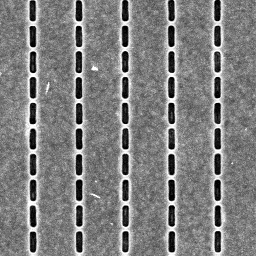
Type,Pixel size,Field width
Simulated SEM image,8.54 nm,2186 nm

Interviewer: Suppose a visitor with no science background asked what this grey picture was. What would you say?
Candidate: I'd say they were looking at a regular array of holes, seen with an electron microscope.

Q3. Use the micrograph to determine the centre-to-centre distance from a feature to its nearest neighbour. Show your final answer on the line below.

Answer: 0.217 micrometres